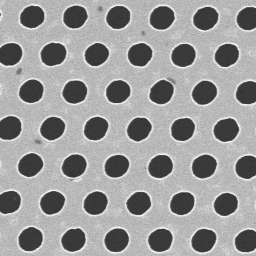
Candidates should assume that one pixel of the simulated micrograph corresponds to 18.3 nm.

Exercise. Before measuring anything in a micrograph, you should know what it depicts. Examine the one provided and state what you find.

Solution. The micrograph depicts a regular array of holes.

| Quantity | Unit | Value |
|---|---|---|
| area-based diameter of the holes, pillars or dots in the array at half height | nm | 438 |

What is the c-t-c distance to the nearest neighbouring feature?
783 nm